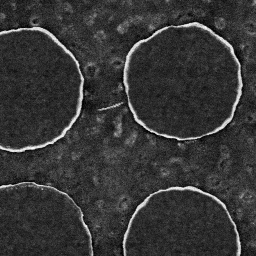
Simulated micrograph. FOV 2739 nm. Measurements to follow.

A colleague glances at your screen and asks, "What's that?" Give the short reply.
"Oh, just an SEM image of raised bodies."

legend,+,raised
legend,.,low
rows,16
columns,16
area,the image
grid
................
................
+++......+++++..
++++....+++++++.
+++++...+++++++.
+++++...+++++++.
+++++...+++++++.
+++++....+++++..
++++......+++...
................
................
.+..............
+++++....+++++..
+++++...++++++..
++++++..+++++++.
++++++..+++++++.